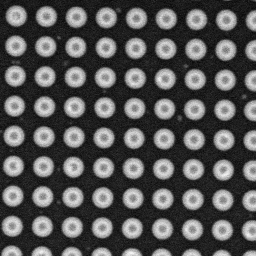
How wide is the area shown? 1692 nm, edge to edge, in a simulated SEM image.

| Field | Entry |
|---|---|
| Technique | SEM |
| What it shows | an array of small figures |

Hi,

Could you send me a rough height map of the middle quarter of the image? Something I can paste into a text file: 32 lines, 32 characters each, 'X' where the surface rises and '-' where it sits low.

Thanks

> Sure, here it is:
--------------------------------
-XXXX----XXX----XXX-----XX------
XXXXX---XXXXX--XXXXX---XXXX----X
XXXXX---XXXXX--XXXXX---XXXXX--XX
-XXXX---XXXXX--XXXXX---XXXXX--XX
-XXX-----XXX----XXX-----XXX----X
--------------------------------
--------------------------------
--XX----------------------------
XXXXX---XXXX----XXXX---XXXX----X
XXXXX---XXXXX--XXXXX---XXXXX--XX
XXXXX---XXXXX--XXXXX---XXXXX--XX
-XXXX---XXXX----XXXX---XXXX---XX
-----------------XX-----XX-----X
--------------------------------
--------------------------------
-XXX----XXXX----XXX-----XX------
XXXXX---XXXX---XXXXX---XXXX---XX
XXXXX--XXXXX---XXXXX---XXXX---XX
XXXXX---XXXX---XXXXX---XXXX---XX
-XXX----XXX-----XXX----XXXX----X
--------------------------------
--------------------------------
-XX-----------------------------
XXXX----XXXX---XXXX----XXXX----X
XXXXX--XXXXX---XXXXX--XXXXX---XX
XXXXX--XXXXX---XXXXX--XXXXX---XX
-XXX----XXXX---XXXX----XXXX---XX
----------------XX------XX-----X
--------------------------------
--------------------------------
XXXX----XXX-----XXX-----XX-----X